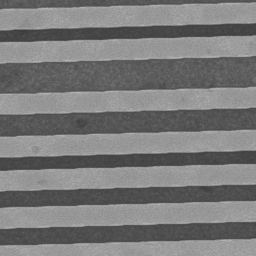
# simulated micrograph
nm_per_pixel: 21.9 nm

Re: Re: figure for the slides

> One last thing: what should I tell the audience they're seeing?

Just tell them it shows lines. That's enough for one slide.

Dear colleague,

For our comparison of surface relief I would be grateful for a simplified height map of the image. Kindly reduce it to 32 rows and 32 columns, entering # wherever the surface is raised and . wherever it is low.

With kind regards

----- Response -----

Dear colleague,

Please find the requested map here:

...........................#####
################################
################################
######..........................
...............................#
################################
################################
##############..................
................................
................................
................................
.............###################
################################
###########################.....
................................
................................
.........................#######
################################
################################
###.............................
................................
################################
################################
###############.................
................................
..................##############
################################
################################
##..............................
................................
.........#######################
################################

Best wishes